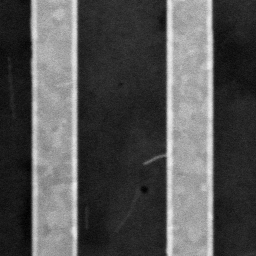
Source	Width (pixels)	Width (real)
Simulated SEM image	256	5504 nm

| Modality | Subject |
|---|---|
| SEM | lines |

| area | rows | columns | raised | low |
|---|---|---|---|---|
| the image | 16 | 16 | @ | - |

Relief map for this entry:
--@@@------@@---
--@@@------@@---
--@@@------@@---
--@@@------@@---
--@@@------@@---
--@@@------@@---
--@@@------@@---
--@@@------@@---
--@@@------@@---
--@@@------@@---
--@@@------@@---
--@@@------@@---
--@@@------@@---
--@@@------@@---
--@@@------@@---
--@@@------@@---